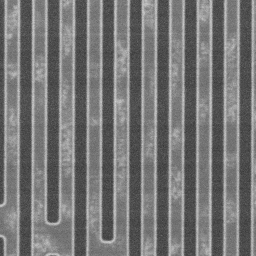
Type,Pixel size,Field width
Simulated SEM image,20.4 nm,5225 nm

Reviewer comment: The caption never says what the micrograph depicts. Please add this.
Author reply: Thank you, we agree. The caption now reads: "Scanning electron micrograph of parallel lines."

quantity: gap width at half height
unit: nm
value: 286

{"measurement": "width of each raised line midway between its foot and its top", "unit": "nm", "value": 268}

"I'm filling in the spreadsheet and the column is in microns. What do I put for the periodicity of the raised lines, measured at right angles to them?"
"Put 0.56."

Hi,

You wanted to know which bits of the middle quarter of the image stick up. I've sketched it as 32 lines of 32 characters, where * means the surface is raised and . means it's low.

**....***....***....***....***..
**....***....***....***....***..
**....***....***....***....***..
**....***....***....***....***..
**....***....***....***....***..
**....***....***....***....***..
**....***....***....***....***..
**....***....***....***....***..
**....***....***....***....***..
**....***....***....***....***..
**....***....***....***....***..
**....***....***....***....***..
**....***....***....***....***..
**....***....***....***....***..
**....***....***....***....***..
**....***....***....***....***..
**....***....***....***....***..
**....***....***....***....***..
**....***....***....***....***..
**....***....***....***....***..
**....***....***....***....***..
**....***....***....***....***..
**....***....***....***....***..
**....***....***....***....***..
**....***....***....***....***..
**....***....***....***....***..
**....***....***....***....***..
**....***....***....***....***..
**....***....***....***....***..
**....***....***....***....***..
**....***....***....***....***..
**....***....***....***....***..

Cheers